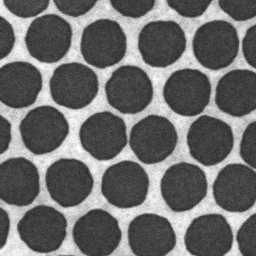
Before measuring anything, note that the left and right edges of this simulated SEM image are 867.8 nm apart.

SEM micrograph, a regular array of holes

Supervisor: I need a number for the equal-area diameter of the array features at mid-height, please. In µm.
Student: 0.163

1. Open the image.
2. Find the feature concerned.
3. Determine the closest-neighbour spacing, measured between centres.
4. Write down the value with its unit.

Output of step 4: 180 nm